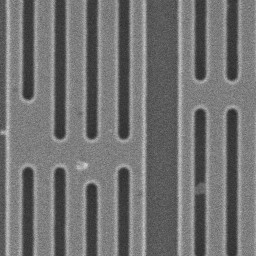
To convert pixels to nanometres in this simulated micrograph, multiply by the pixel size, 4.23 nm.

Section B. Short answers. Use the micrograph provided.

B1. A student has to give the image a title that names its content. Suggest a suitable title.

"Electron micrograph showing groups of lines, slits or small figures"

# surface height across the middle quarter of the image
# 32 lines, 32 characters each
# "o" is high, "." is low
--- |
.ooooo...oooo....ooo.........ooo
.oooo....oooo....ooo.........ooo
.oooo...ooooo...oooo.........ooo
.ooooo..ooooo...oooo.........ooo
.ooooo..ooooo...oooo.........ooo
.ooooo...oooo...oooo.........ooo
.ooooo...oooo...oooo.........ooo
.ooooo..ooooo...oooo.........ooo
.ooooo..ooooo...oooo.........ooo
.ooooo..ooooo...oooo.........ooo
.oooo...ooooo...oooo.........ooo
.oooo...ooooo...oooo.........ooo
.oooo...ooooo...oooo.........ooo
.oooo...ooooo...oooo.........ooo
.ooooo..ooooo...oooo.........ooo
.ooooo..ooooo...oooo.........ooo
.ooooo..ooooo...oooo.........ooo
.ooooo..ooooo...oooo.........ooo
oooooo..oooooo..oooo.........ooo
oooooooooooooooooooo.........ooo
oooooooooooooooooooo.........ooo
oooooooooooooooooooo.........ooo
oooooooooooooooooooo.........ooo
oooooooooooooooooooo.........ooo
oooooooooooooooooooo.........ooo
oooooooooooooooooooo.........ooo
oooooooooooooo..oooo.........ooo
.oooooooooooo...oooo.........ooo
.oooooooooooo...oooo.........ooo
.oooooooooooo...oooo.........ooo
.ooooo..ooooo...oooo.........ooo
.oooo...ooooo...oooo.........ooo